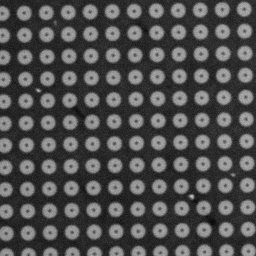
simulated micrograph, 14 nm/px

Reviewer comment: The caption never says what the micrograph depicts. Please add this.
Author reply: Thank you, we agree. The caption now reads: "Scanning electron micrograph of an array of small figures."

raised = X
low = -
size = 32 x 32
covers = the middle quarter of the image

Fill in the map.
--------------------------------
----------------------------XX--
XXX--XXX---XXX--XXX---XXX--XXXX-
XXX--XXXX--XXX--XXX---XXX--XXXX-
XXX--XXX---XXX---XX---XXX---XX--
--------------------------------
--------------------------------
-X----XX---XX----XX---XXX---XX--
XXX--XXXX--XXX--XXXX--XXX--XXXX-
XXX--XXXX--XXX--XXXX--XXX--XXXX-
XXX---XX----X-------------------
--------------------------------
-----------------------X----XX--
XXX---XX---XXX--XXXX--XXX--XXXX-
XXX--XXXX--XXX--XXXX--XXX--XXXX-
XXX---XXX--XXX---XX---XXX---XX--
--------------------------------
--------------------------------
-X----XX----XX---XX---XXX---XXX-
XXX--XXXX--XXX--XXXX--XXX--XXXX-
XXX--XXXX--XXX--XXXX--XXX---XXX-
-XX---XX----X-----X-------------
--------------------------------
-----------------------------X--
XXX---XXX--XXX---XXX--XXX---XXX-
XXX---XXX--XXX---XXX--XXX---XXX-
XXX---XXX--XXX---XXX---XX---XX--
--------------------------------
--------------------------------
-XX---XX----XX---XX---XXX---XXX-
XXXX--XXX--XXX---XXX--XXXX--XXX-
XXXX--XXX--XXXX--XXX--XXX---XXX-